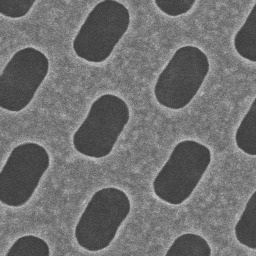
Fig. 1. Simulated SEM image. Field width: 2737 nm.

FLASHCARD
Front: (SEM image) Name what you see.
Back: holes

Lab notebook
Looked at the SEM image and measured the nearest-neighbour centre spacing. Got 0.984 µm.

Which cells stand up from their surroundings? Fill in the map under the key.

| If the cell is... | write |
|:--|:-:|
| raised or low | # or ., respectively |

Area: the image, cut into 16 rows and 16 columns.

..####..##..####
#####...#######.
#####..########.
#..##..####..##.
...#######...###
..########..####
..####..##..####
#####...#######.
#####..########.
#..##..####..##.
...#######...###
..########..####
..####..##..####
#####...#######.
#####..########.
#..##.#####..###